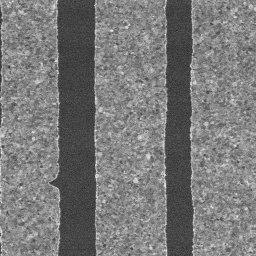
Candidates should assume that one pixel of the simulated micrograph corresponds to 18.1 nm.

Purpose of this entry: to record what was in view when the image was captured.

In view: one or a few lines or trenches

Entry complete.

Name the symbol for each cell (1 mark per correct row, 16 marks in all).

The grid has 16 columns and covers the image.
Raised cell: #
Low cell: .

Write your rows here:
####..####..####
####..####..####
####..####..####
####..####..####
####..####..####
####..####..####
####..####..####
####..####..####
####..####..####
####..####..####
####..####..####
###...####..####
####..####..####
####..####..####
####..####..####
####..####..####